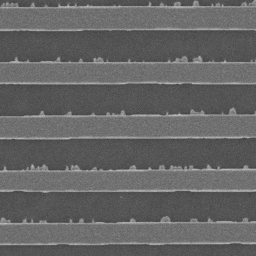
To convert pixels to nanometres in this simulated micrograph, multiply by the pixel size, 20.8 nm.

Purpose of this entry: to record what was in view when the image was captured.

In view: lines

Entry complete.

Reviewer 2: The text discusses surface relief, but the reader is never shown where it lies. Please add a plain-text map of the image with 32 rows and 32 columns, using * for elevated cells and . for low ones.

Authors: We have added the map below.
................................
********************************
********************************
********************************
................................
................................
................................
................................
********************************
********************************
................................
................................
................................
................................
.................*.*.***********
********************************
********************************
................................
................................
................................
................................
********************************
********************************
********************************
................................
................................
................................
................................
********************************
********************************
*******.******....**............
................................